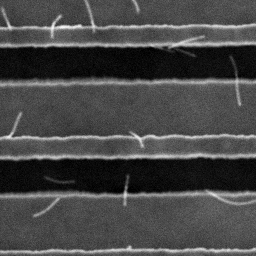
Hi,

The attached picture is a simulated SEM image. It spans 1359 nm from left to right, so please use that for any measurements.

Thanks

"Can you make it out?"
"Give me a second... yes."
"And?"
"lines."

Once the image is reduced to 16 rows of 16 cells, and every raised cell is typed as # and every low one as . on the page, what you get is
################
################
################
................
................
################
################
################
################
################
................
................
################
################
################
################